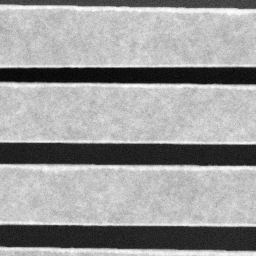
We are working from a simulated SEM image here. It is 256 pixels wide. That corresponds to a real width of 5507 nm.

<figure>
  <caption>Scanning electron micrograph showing lines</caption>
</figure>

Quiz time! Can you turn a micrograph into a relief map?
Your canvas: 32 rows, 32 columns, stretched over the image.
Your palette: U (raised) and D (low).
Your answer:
DDDDDDDDDDDDDDDDDDDDDDDDDDDDDDDD
UUUUUUUUUUUUUUUUUUUUUUUUUUUUUUUU
UUUUUUUUUUUUUUUUUUUUUUUUUUUUUUUU
UUUUUUUUUUUUUUUUUUUUUUUUUUUUUUUU
UUUUUUUUUUUUUUUUUUUUUUUUUUUUUUUU
UUUUUUUUUUUUUUUUUUUUUUUUUUUUUUUU
UUUUUUUUUUUUUUUUUUUUUUUUUUUUUUUU
UUUUUUUUUUUUUUUUUUUUUUUUUUUUUUUU
DDDDDDDDDDDDDDDDDDDDDDDDDDDDDDDD
DDDDDDDDDDDDDDDDDDDDDDDDDDDDDDDD
UUUUUUUUUUUUUDUDDDDDDDDDDDDDDDDD
UUUUUUUUUUUUUUUUUUUUUUUUUUUUUUUU
UUUUUUUUUUUUUUUUUUUUUUUUUUUUUUUU
UUUUUUUUUUUUUUUUUUUUUUUUUUUUUUUU
UUUUUUUUUUUUUUUUUUUUUUUUUUUUUUUU
UUUUUUUUUUUUUUUUUUUUUUUUUUUUUUUU
UUUUUUUUUUUUUUUUUUUUUUUUUUUUUUUU
UUUUUUUUUUUUUUUUUUUUUUUUUUUUUUUU
DDDDDDDDDDDDDDDDDDDDDDDDDDDDDDDD
DDDDDDDDDDDDDDDDDDDDDDDDDDDDDDDD
DDDDDDDDDDDDDDDDDDDDDDDDDDDDDDDD
UUUUUUUUUUUUUUUUUUUUUUUUUUUUUUUU
UUUUUUUUUUUUUUUUUUUUUUUUUUUUUUUU
UUUUUUUUUUUUUUUUUUUUUUUUUUUUUUUU
UUUUUUUUUUUUUUUUUUUUUUUUUUUUUUUU
UUUUUUUUUUUUUUUUUUUUUUUUUUUUUUUU
UUUUUUUUUUUUUUUUUUUUUUUUUUUUUUUU
UUUUUUUUUUUUUUUUUUUUUUUUUUUUUUUU
DDDDDDDDDDDDDDDDDDDDDDDDDDDDDDDD
DDDDDDDDDDDDDDDDDDDDDDDDDDDDDDDD
DDDDDDDDDDDDDDDDDDDDDDDDDDDDDDDD
UUUUUUUUUUUUUUUUUUUUUUUUUUUUUUUU